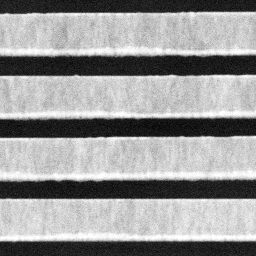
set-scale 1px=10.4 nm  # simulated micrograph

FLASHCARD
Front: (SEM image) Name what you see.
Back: lines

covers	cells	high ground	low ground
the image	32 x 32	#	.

................................
................................
################################
################################
################################
################################
################################
................................
................................
.........#........#####.########
################################
################################
################################
################################
################################
................................
................................
################################
################################
################################
################################
################################
................................
................................
................................
################################
################################
################################
################################
################################
................................
................................